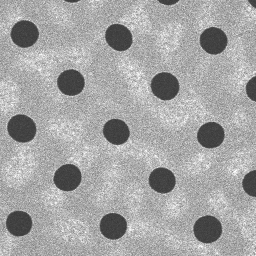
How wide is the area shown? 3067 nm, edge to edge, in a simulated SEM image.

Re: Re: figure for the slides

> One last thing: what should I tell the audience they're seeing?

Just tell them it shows a regular array of holes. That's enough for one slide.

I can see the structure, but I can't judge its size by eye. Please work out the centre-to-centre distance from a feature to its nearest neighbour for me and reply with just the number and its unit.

797 nanometres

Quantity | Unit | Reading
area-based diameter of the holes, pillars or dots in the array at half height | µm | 0.332